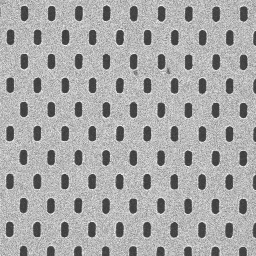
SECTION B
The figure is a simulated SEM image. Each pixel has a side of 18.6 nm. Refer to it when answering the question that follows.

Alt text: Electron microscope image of a regular array of holes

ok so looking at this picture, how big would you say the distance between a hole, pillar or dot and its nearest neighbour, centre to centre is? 506 nanometres